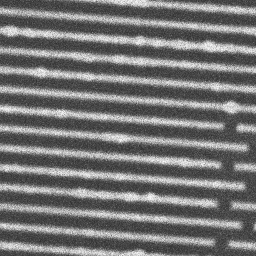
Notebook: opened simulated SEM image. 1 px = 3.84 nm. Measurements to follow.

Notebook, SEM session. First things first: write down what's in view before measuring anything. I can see parallel lines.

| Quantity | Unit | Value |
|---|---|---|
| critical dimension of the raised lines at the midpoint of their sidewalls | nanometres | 25.8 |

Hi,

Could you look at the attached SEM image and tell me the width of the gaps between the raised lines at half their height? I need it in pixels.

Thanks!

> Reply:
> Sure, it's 12.8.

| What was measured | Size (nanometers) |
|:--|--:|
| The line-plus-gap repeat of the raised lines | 74.8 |